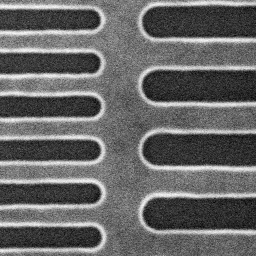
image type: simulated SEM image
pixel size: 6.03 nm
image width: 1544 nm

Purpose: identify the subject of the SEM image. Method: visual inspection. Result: groups of lines, slits or small figures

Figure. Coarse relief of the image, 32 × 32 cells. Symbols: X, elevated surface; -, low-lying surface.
XXXXXXXXXXXXXXXXXXXXXXXXX---XXXX
------------XXXXXX--------------
-------------XXXXX--------------
------------XXXXXX--------------
XXXXXXXXXXXXXXXXXXX-------------
XXXXXXXXXXXXXXXXXXXXXXXXXXXXXXXX
-----------XXXXXXXXXXXXXXXXXXXXX
-------------XXXXXXXXXXXXXXXXXXX
-------------XXXXXXXXXXXXXXXXXXX
---XXXXXXXXXXXXXXX--------------
XXXXXXXXXXXXXXXXXX--------------
XXXXXXXXXXXXXXXXXX--------------
------------XXXXXXX-------------
-------------XXXXXXXXXXXXXXXXXXX
------------XXXXXXXXXXXXXXXXXXXX
XXXXXXXXXXXXXXXXXXXXXXXXXXXXXXXX
XXXXXXXXXXXXXXXXXXXX-XXXXXXXXXXX
------------XXXXXX--------------
-------------XXXXX--------------
-------------XXXXX--------------
XXXXXXXXXXXXXXXXXXX-------------
XXXXXXXXXXXXXXXXXXXXXXXXXXXXXXXX
XXXXXXXXXXXXXXXXXXXXXXXXXXXXXXXX
-------------XXXXXXXXXXXXXXXXXXX
-------------XXXXXX-----XXXXXXX-
------------XXXXXX--------------
XXXXXXXXXXXXXXXXXX--------------
XXXXXXXXXXXXXXXXXX--------------
------------XXXXXXX-------------
-------------XXXXXXXXXXXXXXXXXXX
-------------XXXXXXXXXXXXXXXXXXX
XXXXXXXXXXXXXXXXXXXXXXXXXXXXXXXX